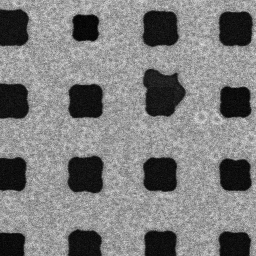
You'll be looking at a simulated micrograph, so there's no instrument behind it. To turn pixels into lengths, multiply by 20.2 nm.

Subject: a regular array of holes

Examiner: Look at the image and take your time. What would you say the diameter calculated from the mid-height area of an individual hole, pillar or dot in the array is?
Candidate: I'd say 0.747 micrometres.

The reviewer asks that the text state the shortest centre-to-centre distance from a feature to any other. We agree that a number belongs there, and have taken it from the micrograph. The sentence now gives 1470 nm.